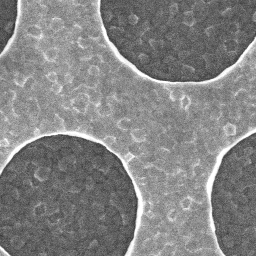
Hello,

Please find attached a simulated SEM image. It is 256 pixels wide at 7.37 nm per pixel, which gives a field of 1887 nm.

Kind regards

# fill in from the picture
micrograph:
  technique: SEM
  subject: holes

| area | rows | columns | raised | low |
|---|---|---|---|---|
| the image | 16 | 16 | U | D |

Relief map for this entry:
DUUUUUDDDDDDDDDD
DUUUUUDDDDDDDDDD
DUUUUUUDDDDDDDDD
UUUUUUUUDDDDDDDU
UUUUUUUUUDDDDDUU
UUUUUUUUUUUUUUUU
UUUUUUUUUUUUUUUU
UUUUUUUUUUUUUUUU
UUUDDUUUUUUUUUUD
UDDDDDDUUUUUUUDD
DDDDDDDDUUUUUUDD
DDDDDDDDUUUUUDDD
DDDDDDDDDUUUUDDD
DDDDDDDDDUUUUDDD
DDDDDDDDUUUUUDDD
DDDDDDDDUUUUUUDD